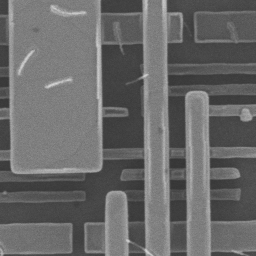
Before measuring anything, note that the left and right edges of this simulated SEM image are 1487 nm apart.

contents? wiring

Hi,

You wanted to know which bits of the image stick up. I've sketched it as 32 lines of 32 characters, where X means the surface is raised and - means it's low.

-XXXXXXXXXXXX-----XXX-----------
-XXXXXXXXXXXX-----XXX-----------
-XXXXXXXXXXXX-----XXX-----------
-XXXXXXXXXXXX-----XXX-----------
-XXXXXXXXXXXX-----XXX-----------
-XXXXXXXXXXXX-----XXX-----------
-XXXXXXXXXXXX-----XXX-----------
-XXXXXXXXXXXX-----XXX-----------
-XXXXXXXXXXXX-----XXX-----------
-XXXXXXXXXXXX-----XXX-----------
-XXXXXXXXXXXX-----XXX-----------
-XXXXXXXXXXXX-----XXX---XX------
-XXXXXXXXXXXX-----XXX--XXX------
-XXXXXXXXXXXX-----XXX--XXX------
-XXXXXXXXXXXX-----XXX--XXX------
-XXXXXXXXXXXX-----XXX--XXX------
-XXXXXXXXXXXX-----XXX--XXX------
-XXXXXXXXXXXX-----XXX--XXX------
-XXXXXXXXXXXX-----XXX--XXX------
-XXXXXXXXXXXX-----XXX--XXX------
-XXXXXXXXXXXX-----XXX--XXX------
--XXXXXXXXXX------XXX--XXX------
------------------XXX--XXX------
------------------XXX--XXX------
-------------XXX--XXX--XXX------
-------------XXX--XXX--XXX------
-------------XXX--XXX--XXX------
-------------XXX--XXX--XXX------
-------------XXX--XXX--XXX------
-------------XXX--XXX--XXX------
-------------XXX--XXX--XXX------
-------------XXX--XXX--XXX------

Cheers